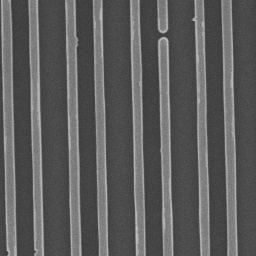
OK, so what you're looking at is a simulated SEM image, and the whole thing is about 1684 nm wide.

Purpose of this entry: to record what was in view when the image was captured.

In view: parallel lines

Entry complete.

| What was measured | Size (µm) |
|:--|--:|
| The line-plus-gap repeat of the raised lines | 0.208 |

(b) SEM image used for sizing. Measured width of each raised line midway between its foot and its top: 60 nanometres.